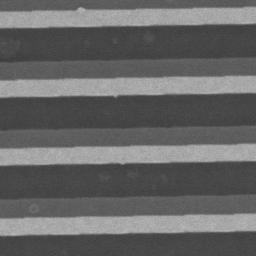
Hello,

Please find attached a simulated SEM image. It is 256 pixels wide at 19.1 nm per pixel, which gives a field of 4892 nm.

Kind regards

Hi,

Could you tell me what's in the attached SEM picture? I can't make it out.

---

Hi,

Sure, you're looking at lines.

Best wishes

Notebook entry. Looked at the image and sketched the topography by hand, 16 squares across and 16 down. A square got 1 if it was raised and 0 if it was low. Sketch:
1111111111111111
1111111111111000
0000000000000000
0000000000000000
1111111111111111
1111111111111111
0000000000000000
0000000000000000
1111111111111111
1111111111111111
0000000000000000
0000000000000000
0111111111111111
1111111111111111
1111111111110000
0000000000000000